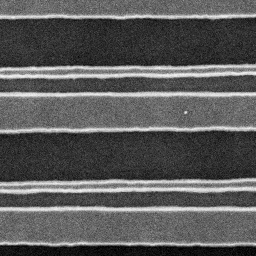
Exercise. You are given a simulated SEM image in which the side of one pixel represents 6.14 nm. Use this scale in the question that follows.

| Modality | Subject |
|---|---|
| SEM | lines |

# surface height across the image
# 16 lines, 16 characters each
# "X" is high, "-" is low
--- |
XXXXXXXXXXXXXXXX
----------------
----------------
----------------
XXXXXXXXXXXXXXXX
XXXXXXXXXXXXXXXX
XXXXXXXXXXXXXXXX
XXXXXXXXXXXXXXXX
----------------
----------------
----------------
XXXXXXXXXXXXXXXX
XXXXXXXXXXXXXXXX
XXXXXXXXXXXXXXXX
XXXXXXXXXXXXXXXX
----------------